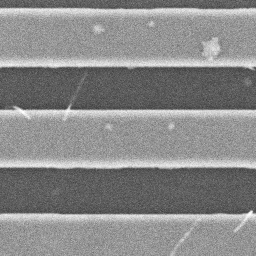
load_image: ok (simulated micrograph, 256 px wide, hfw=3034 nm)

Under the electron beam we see lines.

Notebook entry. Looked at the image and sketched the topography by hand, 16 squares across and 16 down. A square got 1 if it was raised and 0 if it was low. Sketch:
0000000000000000
1111111111111111
1111111111111111
1111111111111111
0000000000000000
0000000000000000
0000000000000000
1111111111111111
1111111111111111
1111111111111111
0000000000000000
0000000000000000
0000000000000000
1111111111111111
1111111111111111
1111111111111111